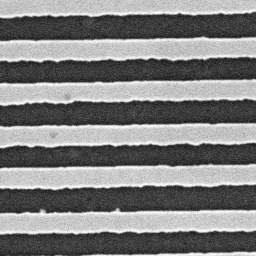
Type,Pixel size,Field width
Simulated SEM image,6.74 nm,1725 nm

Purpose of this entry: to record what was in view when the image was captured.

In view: lines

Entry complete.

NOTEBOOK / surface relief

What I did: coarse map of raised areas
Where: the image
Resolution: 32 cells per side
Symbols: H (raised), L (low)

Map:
HHHHHHHHHHHHHHHHHHHHHHHHHHHHHHHH
HHHHHHHHHHHHHHHHHHHHHHHHHHHHHHHL
LLLLLLLLLLLLLLLLLLLLLLLLLLLLLLLL
LLLLLLLLLLLLLLLLLLLLLLLLLLLLLLLL
LLLLLLLLLLLLLLLLLLLLLLLLLLLLLLLL
HHHHHHHHHHHHHHHHHHHHHHHHHHHHHHHH
HHHHHHHHHHHHHHHHHHHHHHHHHHHHHHHH
LHLLHHLHLLLLLLLLLLLLLLLLLLLLLLLL
LLLLLLLLLLLLLLLLLLLLLLLLLLLLLLLL
LLLLLLLLLLLLLLLLLLLLLLLLLLLLLLLL
LLLLLHHHHHHHHHHHHHHHHHHHHHHHHHHH
HHHHHHHHHHHHHHHHHHHHHHHHHHHHHHHH
HHHHHHHHHHHHHHHHHLHLHHHLLLLLLLLL
LLLLLLLLLLLLLLLLLLLLLLLLLLLLLLLL
LLLLLLLLLLLLLLLLLLLLLLLLLLLLLLLL
LLLLLLLLLLLLLLLLLLLLLLLLLLLLLLLL
HHHHHHHHHHHHHHHHHHHHHHHHHHHHHHHH
HHHHHHHHHHHHHHHHHHHHHHHHHHHHHHHH
LLLLLLLLLLLLLLLLLLLLLLLLLLLLLLLL
LLLLLLLLLLLLLLLLLLLLLLLLLLLLLLLL
LLLLLLLLLLLLLLLLLLLLLLLLLLLLLLLL
HHHHHHHHHHHHHHHHHHHHHHHHHHHHHHHH
HHHHHHHHHHHHHHHHHHHHHHHHHHHHHHHH
HHHHHHHHLLLLLLLLLLLLLLLLLLLLLLLL
LLLLLLLLLLLLLLLLLLLLLLLLLLLLLLLL
LLLLLLLLLLLLLLLLLLLLLLLLLLLLLLLL
LLLLLLLLLLLLLLHLLHHHHHHHHHHHHHHH
HHHHHHHHHHHHHHHHHHHHHHHHHHHHHHHH
HHHHHHHHHHHHHHHHHHHHHHHHHHHHHHHH
LLLLLLLLLLLLLLLLLLLLLLLLLLLLLLLL
LLLLLLLLLLLLLLLLLLLLLLLLLLLLLLLL
LLLLLLLLLLLLLLLLLLLLLLLLLLLLLLLL